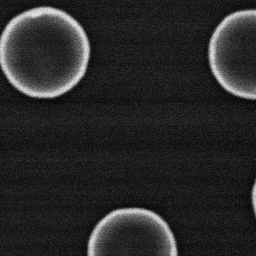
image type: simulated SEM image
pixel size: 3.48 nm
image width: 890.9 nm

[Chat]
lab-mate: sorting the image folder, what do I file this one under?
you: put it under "raised bodies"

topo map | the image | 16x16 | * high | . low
................
.****.........**
*****........***
*****........***
*****........***
.***..........**
................
................
................
................
................
................
................
.......***......
......*****.....
......*****.....